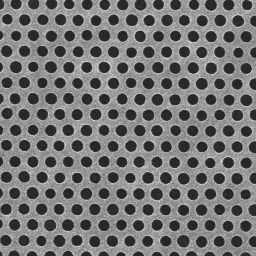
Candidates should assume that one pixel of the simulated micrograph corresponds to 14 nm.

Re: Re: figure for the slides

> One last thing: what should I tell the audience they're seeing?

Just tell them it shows a regular array of holes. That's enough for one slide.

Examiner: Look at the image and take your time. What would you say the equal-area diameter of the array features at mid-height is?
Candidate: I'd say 160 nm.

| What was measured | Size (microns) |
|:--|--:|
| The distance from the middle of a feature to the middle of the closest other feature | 0.245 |